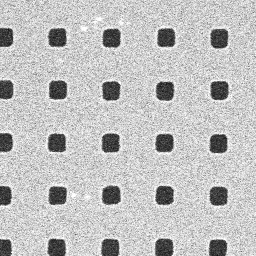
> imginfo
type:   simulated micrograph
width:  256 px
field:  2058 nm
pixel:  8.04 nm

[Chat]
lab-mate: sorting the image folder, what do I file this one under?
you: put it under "a regular array of holes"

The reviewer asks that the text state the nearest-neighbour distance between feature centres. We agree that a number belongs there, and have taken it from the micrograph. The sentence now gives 420 nanometres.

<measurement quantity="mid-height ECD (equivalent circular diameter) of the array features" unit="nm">163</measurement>